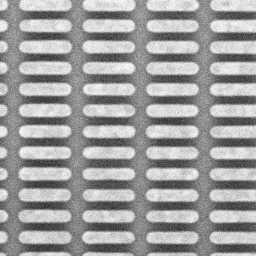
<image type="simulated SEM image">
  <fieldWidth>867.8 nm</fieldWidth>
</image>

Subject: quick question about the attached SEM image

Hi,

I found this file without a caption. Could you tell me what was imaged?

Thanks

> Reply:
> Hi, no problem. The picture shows groups of lines, slits or small figures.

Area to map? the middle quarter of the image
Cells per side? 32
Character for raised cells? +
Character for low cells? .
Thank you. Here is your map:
++...++++++++++++....+++++++++++
++...+++++++++++++...+++++++++++
................................
................................
................................
+....++++++++++++....+++++++++++
++...+++++++++++++...+++++++++++
+.......+++++++++....+++++++++++
................................
................................
+.....+++++++++++....+++++++++++
++...+++++++++++++...+++++++++++
+....++++++++++++....+++++++++++
................................
................................
......................+++++++...
+....+++++++++++++...+++++++++++
+....+++++++++++++...+++++++++++
................................
................................
................................
+....++++++++++++....+++++++++++
++...+++++++++++++...+++++++++++
+.....+++++++++++.....++++++++++
................................
................................
+....++++++++++++....+++++++++++
++...+++++++++++++...+++++++++++
+....++++++++++++....+++++++++++
................................
................................
................................